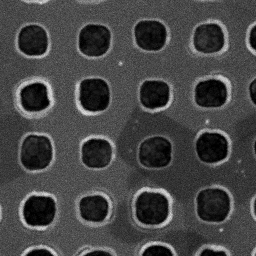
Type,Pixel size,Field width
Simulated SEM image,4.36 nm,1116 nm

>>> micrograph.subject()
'a regular array of holes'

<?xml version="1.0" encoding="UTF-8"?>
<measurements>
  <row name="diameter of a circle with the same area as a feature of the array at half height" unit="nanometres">139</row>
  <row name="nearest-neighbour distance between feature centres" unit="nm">240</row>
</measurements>